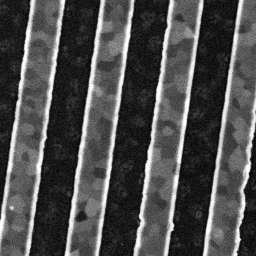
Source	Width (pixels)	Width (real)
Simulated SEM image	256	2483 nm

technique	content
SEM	one or a few lines or trenches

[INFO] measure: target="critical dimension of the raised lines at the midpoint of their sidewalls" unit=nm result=300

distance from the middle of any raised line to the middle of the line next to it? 665 nm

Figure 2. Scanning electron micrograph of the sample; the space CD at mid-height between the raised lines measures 366 nm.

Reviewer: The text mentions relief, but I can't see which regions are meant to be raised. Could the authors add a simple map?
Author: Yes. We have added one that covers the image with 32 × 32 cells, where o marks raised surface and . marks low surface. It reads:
....oooo.....oooo....oooo.....oo
....oooo.....ooo.....oooo.....oo
....oooo....oooo.....oooo.....oo
....ooo.....oooo.....oooo.....oo
...oooo.....oooo.....oooo....ooo
...oooo.....oooo.....oooo....ooo
...oooo.....oooo....oooo.....ooo
...oooo.....oooo....oooo.....ooo
...oooo.....ooo.....oooo.....ooo
...oooo....oooo.....oooo.....ooo
...ooo.....oooo.....oooo.....ooo
...ooo.....oooo.....oooo....oooo
..oooo.....oooo.....ooo.....oooo
..oooo.....oooo.....ooo.....oooo
..oooo.....oooo....oooo.....oooo
..oooo.....ooo.....oooo.....oooo
..oooo....oooo.....oooo.....oooo
..oooo....oooo.....oooo.....ooo.
.oooo.....oooo.....oooo....oooo.
.oooo.....oooo.....oooo....oooo.
.oooo.....oooo....oooo.....oooo.
.oooo.....oooo....oooo.....oooo.
.oooo.....ooo.....oooo.....oooo.
.oooo....oooo.....oooo.....ooo..
.ooo.....oooo.....oooo.....ooo..
oooo.....oooo.....oooo....oooo..
oooo.....oooo.....oooo....oooo..
oooo.....oooo.....ooo.....oooo..
oooo.....oooo....oooo.....oooo..
oooo.....ooo.....oooo.....oooo..
oooo....oooo.....oooo.....oooo..
oooo....oooo.....oooo.....oooo..